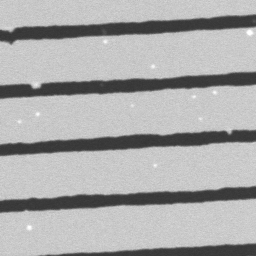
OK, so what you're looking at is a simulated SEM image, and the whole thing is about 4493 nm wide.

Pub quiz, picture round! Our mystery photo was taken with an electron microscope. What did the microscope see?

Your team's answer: parallel lines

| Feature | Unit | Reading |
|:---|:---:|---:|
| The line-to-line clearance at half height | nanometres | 745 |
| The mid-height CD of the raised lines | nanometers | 256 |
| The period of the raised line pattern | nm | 1000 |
